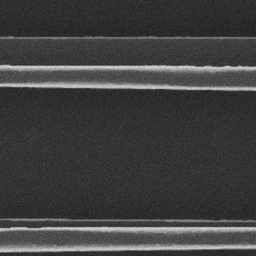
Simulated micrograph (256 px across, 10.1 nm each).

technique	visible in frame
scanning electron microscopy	lines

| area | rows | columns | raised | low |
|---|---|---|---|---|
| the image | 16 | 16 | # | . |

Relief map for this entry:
................
................
################
################
################
........########
................
................
................
................
................
................
................
................
################
##############..